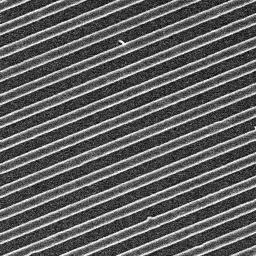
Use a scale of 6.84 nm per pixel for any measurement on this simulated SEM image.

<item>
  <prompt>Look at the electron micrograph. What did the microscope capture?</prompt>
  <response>parallel lines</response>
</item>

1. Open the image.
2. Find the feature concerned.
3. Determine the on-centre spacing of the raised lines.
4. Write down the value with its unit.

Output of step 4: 147 nm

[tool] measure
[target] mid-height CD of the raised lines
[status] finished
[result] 0.0666 microns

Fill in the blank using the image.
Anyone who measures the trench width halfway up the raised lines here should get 79.2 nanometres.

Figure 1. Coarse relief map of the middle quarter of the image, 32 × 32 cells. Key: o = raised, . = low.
.ooooooo........oooooo........oo
ooooo........oooooo.........oooo
ooo........oooooo........oooooo.
........ooooooo........oooooo...
......oooooo........ooooooo.....
....oooooo........oooooo........
.oooooo.........ooooo.........oo
ooooo........oooooo........ooooo
oo.........ooooo.........oooooo.
........oooooo........oooooo....
......ooooo.........oooooo......
...oooooo........oooooo.........
.oooooo........oooooo........ooo
oooo.........ooooo.........ooooo
oo........oooooo........ooooooo.
........ooooo.........ooooo.....
.....oooooo........oooooo.......
...ooooo.........oooooo........o
oooooo........oooooo.........ooo
oooo........oooooo........oooooo
o........ooooooo........oooooo..
.......oooooo........oooooo.....
.....oooooo........oooooo.......
..oooooo........ooooooo.......oo
oooooo........oooooo........oooo
oooo.......ooooooo.......ooooooo
o........oooooo........oooooo...
......ooooooo........oooooo.....
....oooooo........oooooo........
..oooooo........oooooo........oo
ooooo........ooooooo........oooo
ooo........oooooo........oooooo.